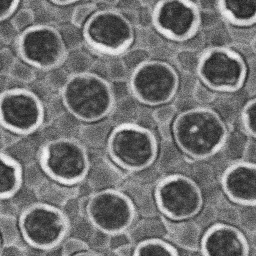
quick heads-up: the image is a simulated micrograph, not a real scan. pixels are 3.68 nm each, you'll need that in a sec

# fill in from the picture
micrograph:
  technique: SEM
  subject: a regular array of raised bodies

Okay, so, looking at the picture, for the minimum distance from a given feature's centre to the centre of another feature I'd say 248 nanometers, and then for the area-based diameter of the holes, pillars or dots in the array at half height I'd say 0.168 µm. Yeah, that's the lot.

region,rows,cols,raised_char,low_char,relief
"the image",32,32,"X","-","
XX-----X------------XXXX---XXXXX
XX----------XX-----XXXXXX---XXXX
-----------XXXXX---XXXXXX----XXX
----XX----XXXXXX---XXXXXX-------
---XXXXX--XXXXXXX----XXX--------
--XXXXXX---XXXXX----------------
---XXXXX-----XX-----------XXX---
---XXXX------------------XXXXX--
-----------------XXXX----XXXXXX-
---------XXX----XXXXXX---XXXXXX-
--------XXXXX---XXXXXX----XXXX--
-XXX----XXXXXX---XXXXX----------
XXXXX---XXXXXX---XXXX-----------
XXXXX---XXXXXX-----------------X
XXXXX-----XXX---------XXXXX---XX
XXXXX----------XX-----XXXXXX---X
--XX----------XXXXX---XXXXXX---X
-------X------XXXXX---XXXXXX----
-----XXXXX----XXXXXX---XXXXX----
X----XXXXXX---XXXXX-----XX------
XX---XXXXXX----XXXX----------XX-
XXX---XXXXX-----------------XXXX
XXX----XXX----------XXXX----XXXX
XX------------------XXXXX---XXXX
X-----------XXXX---XXXXXX---XXXX
-----------XXXXXX---XXXXX-----XX
---XXXXX---XXXXXX---XXXXX-------
--XXXXXX---XXXXXX---------------
---XXXXX----XXXX----------XXX---
---XXXXX-----------------XXXXX--
----XXX----------XXXX----XXXXXX-
-----------------XXXXX---XXXXXX-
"